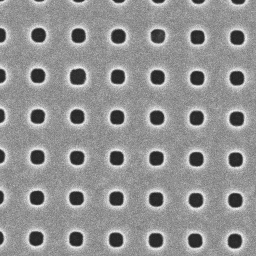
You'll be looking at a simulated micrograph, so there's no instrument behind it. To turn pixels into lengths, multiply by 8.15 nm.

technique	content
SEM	a regular array of holes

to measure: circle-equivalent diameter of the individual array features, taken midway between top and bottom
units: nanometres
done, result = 124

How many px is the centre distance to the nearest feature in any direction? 39.5